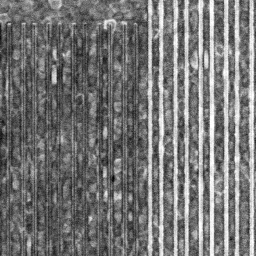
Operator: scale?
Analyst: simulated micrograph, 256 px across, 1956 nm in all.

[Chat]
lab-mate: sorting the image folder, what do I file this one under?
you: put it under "parallel lines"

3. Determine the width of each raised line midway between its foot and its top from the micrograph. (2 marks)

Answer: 0.021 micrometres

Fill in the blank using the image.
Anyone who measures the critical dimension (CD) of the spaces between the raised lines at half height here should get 0.084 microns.